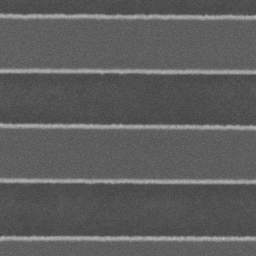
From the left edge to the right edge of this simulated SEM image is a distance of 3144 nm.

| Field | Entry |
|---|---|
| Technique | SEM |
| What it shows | lines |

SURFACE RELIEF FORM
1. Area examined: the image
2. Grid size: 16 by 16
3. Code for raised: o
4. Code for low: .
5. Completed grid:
................
oooooooooooooooo
oooooooooooooooo
oooooooooooooooo
.....ooooooooooo
................
................
................
oooooooooooooooo
oooooooooooooooo
oooooooooooooooo
................
................
................
................
oooooooooooooooo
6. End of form